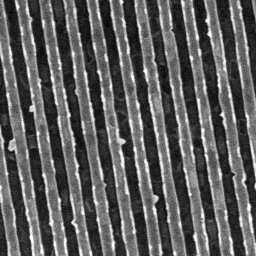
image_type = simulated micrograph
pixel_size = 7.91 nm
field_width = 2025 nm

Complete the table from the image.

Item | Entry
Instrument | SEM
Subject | parallel lines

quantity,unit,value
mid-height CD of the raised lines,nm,93.7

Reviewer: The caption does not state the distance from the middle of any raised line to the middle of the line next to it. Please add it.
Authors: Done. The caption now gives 184 nanometers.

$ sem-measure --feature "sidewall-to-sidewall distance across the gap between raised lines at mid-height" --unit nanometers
93.7